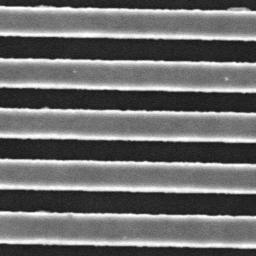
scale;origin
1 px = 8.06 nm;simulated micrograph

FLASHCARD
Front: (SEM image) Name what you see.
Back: lines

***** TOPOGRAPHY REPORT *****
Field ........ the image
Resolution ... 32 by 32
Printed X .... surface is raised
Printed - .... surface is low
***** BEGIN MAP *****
--------------------------------
XXXXXXXXXXXXXXXXXXXXXXXXXXXXXXXX
XXXXXXXXXXXXXXXXXXXXXXXXXXXXXXXX
XXXXXXXXXXXXXXXXXXXXXXXXXXXXXXXX
---XXXXXXXXXXXXXXXXXXXXXXXXXXXXX
--------------------------------
--------------------------------
XXXXXX-XX-----------------------
XXXXXXXXXXXXXXXXXXXXXXXXXXXXXXXX
XXXXXXXXXXXXXXXXXXXXXXXXXXXXXXXX
XXXXXXXXXXXXXXXXXXXXXXXXXXXXXXXX
--------------------------------
--------------------------------
--------------------------------
XXXXXXXXXXXXXXXXXXXXXXXXXXXXXXXX
XXXXXXXXXXXXXXXXXXXXXXXXXXXXXXXX
XXXXXXXXXXXXXXXXXXXXXXXXXXXXXXXX
------------------XXXXXXXXXXXXXX
--------------------------------
--------------------------------
XXXXXXXXXXXXXXXXXXXXXXXXXXXX----
XXXXXXXXXXXXXXXXXXXXXXXXXXXXXXXX
XXXXXXXXXXXXXXXXXXXXXXXXXXXXXXXX
XXXXXXXXXXXXXXXXXXXXXXXXXXXXXXXX
--------------------------------
--------------------------------
--------------------------------
XXXXXXXXXXXXXXXXXXXXXXXXXXXXXXXX
XXXXXXXXXXXXXXXXXXXXXXXXXXXXXXXX
XXXXXXXXXXXXXXXXXXXXXXXXXXXXXXXX
---------XXXXXXXXXXXXXXXXXXXXXXX
--------------------------------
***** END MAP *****